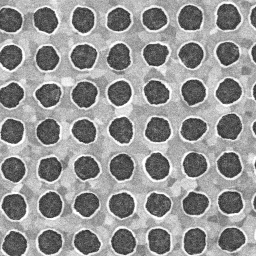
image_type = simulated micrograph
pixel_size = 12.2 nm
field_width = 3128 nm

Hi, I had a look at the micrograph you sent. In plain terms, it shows a regular array of holes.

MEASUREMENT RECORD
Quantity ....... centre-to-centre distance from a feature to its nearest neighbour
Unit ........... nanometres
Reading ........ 435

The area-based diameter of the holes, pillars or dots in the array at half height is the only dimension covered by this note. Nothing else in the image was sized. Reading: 319 nanometers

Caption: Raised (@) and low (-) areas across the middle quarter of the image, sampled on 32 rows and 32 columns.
@@-----@@@@-----@@@@@@--@@@@@@--
@@@@-@@@@@@@@-@@@@@@@@@@@@@@@@@@
@@@@@@@@@@@@@@@@@@@@@@@@@@@@@@@@
@@@@@@@@@@@@@@@@@@@@@@@@@@@@@@@@
@@@@---@@@@@@---@@@@@----@@@@@--
@@@-----@@@------@@@------@@@---
@@-------@@------@@@-------@@---
@@-------@@------@@@-------@@---
@@------@@@------@@@@-----@@@@--
@@------@@@-----@@@@@-----@@@@--
@@@----@@@@@@--@@@@@@@@@@@@@@@@@
@@@@@@@@@@@@@@@@@@@@@@@@@@@@@@@@
@@@@@@@@@@@@@@@@@@@@@@@@@@@@@@@@
@@@@@-@@@@@@@---@@@@@@---@@@@@@-
@@@----@@@@@-----@@@@-----@@@@--
@@------@@@------@@@@------@@---
@@------@@@------@@@-------@@---
@@------@@@------@@@-------@@---
@@@-----@@@@-----@@@------@@@@--
@@@@---@@@@@@----@@@@@---@@@@@@-
@@@@@@@@@@@@@@@@@@@@@@@@@@@@@@@@
@@@@@@@@@@@@@@@@@@@@@@@@@@@@@@@@
@@@@@@@@@@@@@@--@@@@@@--@@@@@@@-
@@@@---@@@@@-----@@@@-----@@@@--
@@@-----@@@@-----@@@------@@@@--
@@-------@@-------@@-------@@@--
@@@------@@-------@@-------@@@--
@@@------@@@-----@@@@-----@@@@--
@@@@----@@@@@----@@@@@---@@@@@@-
@@@@@@@@@@@@@@@@@@@@@@@@@@@@@@@@
@@@@@@@@@@@@@@@@@@@@@@@@@@@@@@@@
@@@@@@@@@@@@@@@@@@@@@@@@@@@@@@@@